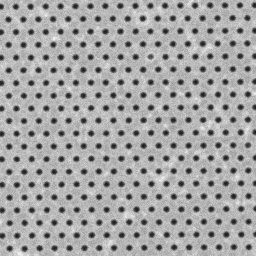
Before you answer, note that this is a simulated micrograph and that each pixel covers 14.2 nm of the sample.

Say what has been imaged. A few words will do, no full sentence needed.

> a regular array of holes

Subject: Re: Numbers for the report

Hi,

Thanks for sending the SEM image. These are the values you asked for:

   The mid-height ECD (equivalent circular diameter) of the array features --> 93.6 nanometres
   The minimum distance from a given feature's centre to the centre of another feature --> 206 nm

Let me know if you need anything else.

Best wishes